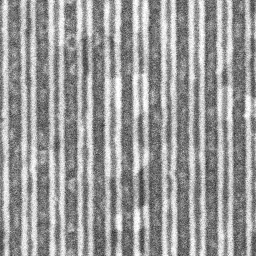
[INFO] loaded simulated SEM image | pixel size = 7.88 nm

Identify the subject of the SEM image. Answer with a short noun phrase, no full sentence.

parallel lines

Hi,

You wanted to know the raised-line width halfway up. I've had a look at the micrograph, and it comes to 89.6 nanometres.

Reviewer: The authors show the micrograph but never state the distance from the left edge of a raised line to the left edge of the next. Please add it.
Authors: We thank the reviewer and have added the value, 221 nm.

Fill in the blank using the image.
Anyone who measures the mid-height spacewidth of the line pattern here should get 130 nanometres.